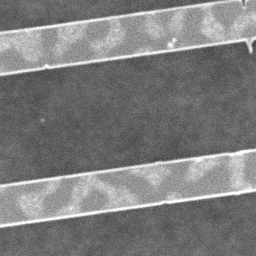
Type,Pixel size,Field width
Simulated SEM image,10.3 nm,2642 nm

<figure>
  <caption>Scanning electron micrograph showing one or a few lines or trenches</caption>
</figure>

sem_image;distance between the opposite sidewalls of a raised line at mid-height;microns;0.42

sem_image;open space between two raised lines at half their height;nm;1130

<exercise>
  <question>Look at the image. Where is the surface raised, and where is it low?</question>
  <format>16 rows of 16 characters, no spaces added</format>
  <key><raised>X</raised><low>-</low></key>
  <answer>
-----------XXXXX
----XXXXXXXXXXXX
XXXXXXXXXXXXXXXX
XXXXXXXX--------
X---------------
----------------
----------------
----------------
----------------
---------------X
--------XXXXXXXX
-XXXXXXXXXXXXXXX
XXXXXXXXXXXX----
XXXXX-----------
----------------
----------------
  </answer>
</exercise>